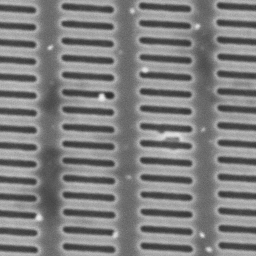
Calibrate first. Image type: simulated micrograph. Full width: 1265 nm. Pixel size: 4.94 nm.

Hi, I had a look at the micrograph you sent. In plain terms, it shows a regular array of holes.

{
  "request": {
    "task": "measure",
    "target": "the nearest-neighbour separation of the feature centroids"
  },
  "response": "84 nm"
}